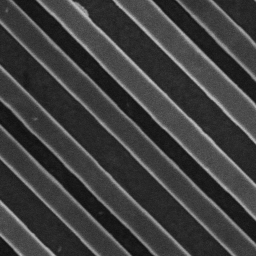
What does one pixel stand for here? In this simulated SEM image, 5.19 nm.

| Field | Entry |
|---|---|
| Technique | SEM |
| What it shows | lines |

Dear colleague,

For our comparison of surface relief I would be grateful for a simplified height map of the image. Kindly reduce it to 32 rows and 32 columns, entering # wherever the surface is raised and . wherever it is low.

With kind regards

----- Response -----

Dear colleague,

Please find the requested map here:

##...####......####...#####.....
###...####......####...#####....
####...####......####...#####...
.####...####......####...#####..
..####...####......####...#####.
...####...####......####...#####
....####...####......####...####
.....####...####......####...###
......####...####......####...##
#......####...####......####...#
##......####...####......####...
###......####...####......####..
####......####...####......####.
.####......####...####......####
..####......####...####.....####
...####......####...####......##
#...####......####...####......#
##...####......####...#####....#
###...####......####...####.....
####...####......####...####....
.####...####......####...####...
..####...####......####...####..
...####...####......####...####.
....####...####......####...####
.....####...####......####...###
......####...####......####...##
#......####...####......####...#
##......####...####......####...
###......####...####......####..
####......####...####......####.
.####......####...####......####
..####......####...####......###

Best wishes